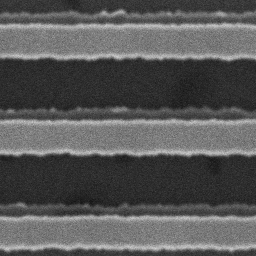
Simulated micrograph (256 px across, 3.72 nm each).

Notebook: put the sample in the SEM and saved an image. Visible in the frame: lines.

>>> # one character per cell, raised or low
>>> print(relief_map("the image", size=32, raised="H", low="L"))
LLLLLLLLLLLLLLLLLLLLLLLLLLLLLLLL
LLLLLLLLLLLLLLLLLLLLLLLLLLLLLLLL
LLLLLLLLLLLLLLLLLLLLLLLLLLLLLLLL
HHHHHHHHHHHHHHHHHHHHHHHHHHHHHHHH
HHHHHHHHHHHHHHHHHHHHHHHHHHHHHHHH
HHHHHHHHHHHHHHHHHHHHHHHHHHHHHHHH
HHHHHHHHHHHHHHHHHHHHHHHHHHHHHHHH
LLLLLLLLLLLLLLLLLLLLLLLLLLLLHLLL
LLLLLLLLLLLLLLLLLLLLLLLLLLLLLLLL
LLLLLLLLLLLLLLLLLLLLLLLLLLLLLLLL
LLLLLLLLLLLLLLLLLLLLLLLLLLLLLLLL
LLLLLLLLLLLLLLLLLLLLLLLLLLLLLLLL
LLLLLLLLLLLLLLLLLLLLLLLLLLLLLLLL
LLLLLLLLLLLLLLLLLLLLLLLLLLLLLLLL
LLLLLLLLLLLLLLLLLLLLLLLLLLLLLLLL
HHHHHHHHHHHHHHHHHHHHHHHHHHHHHHHH
HHHHHHHHHHHHHHHHHHHHHHHHHHHHHHHH
HHHHHHHHHHHHHHHHHHHHHHHHHHHHHHHH
HHHHHHHHHHHHHHHHHHHHHHHHHHHHHHHH
LLLLLLLLLLLLLLLLLLLLLLLLLLLLLLLL
LLLLLLLLLLLLLLLLLLLLLLLLLLLLLLLL
LLLLLLLLLLLLLLLLLLLLLLLLLLLLLLLL
LLLLLLLLLLLLLLLLLLLLLLLLLLLLLLLL
LLLLLLLLLLLLLLLLLLLLLLLLLLLLLLLL
LLLLLLLLLLLLLLLLLLLLLLLLLLLLLLLL
LLLLLLLLLLLLLLLLLLLLLLLLLLLLLLLL
LLLLLLLLLLLLLLLLLLLLLLLLLLLLLLLL
HHHHHHHHHHHHHHHHHHHHHHHHHHHHHHHH
HHHHHHHHHHHHHHHHHHHHHHHHHHHHHHHH
HHHHHHHHHHHHHHHHHHHHHHHHHHHHHHHH
HHHHHHHHHHHHHHHHHHHHHHHHHHHHHHHH
LLLLLLLLLLLLLLLLLLLLLLLLLLLLLLLL